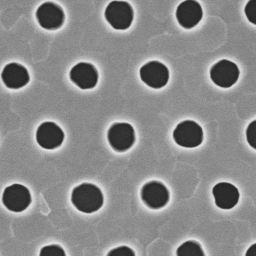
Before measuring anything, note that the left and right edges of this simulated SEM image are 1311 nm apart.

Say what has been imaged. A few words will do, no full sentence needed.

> a regular array of holes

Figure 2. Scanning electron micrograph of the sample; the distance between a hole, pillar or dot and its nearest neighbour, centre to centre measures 0.351 micrometres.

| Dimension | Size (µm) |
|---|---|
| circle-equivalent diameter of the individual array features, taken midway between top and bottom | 0.144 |